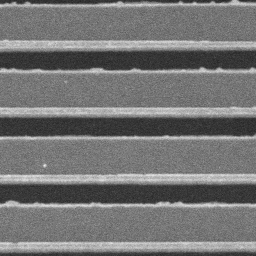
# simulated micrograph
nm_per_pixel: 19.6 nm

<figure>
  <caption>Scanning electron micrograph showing lines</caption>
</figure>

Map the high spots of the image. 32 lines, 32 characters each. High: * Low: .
.*.*..........**......*.*.******
********************************
********************************
********************************
********************************
********************************
................................
................................
................................
********************************
********************************
********************************
********************************
********************************
................................
................................
................................
********************************
********************************
********************************
********************************
********************************
********************************
................................
................................
***.*..............****.........
********************************
********************************
********************************
********************************
********************************
................................